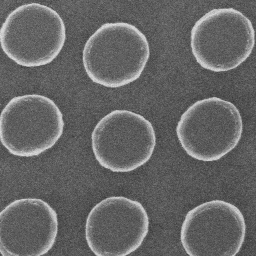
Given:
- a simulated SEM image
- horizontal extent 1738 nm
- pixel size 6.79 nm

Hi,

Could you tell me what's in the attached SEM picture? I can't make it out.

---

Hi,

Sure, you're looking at raised bodies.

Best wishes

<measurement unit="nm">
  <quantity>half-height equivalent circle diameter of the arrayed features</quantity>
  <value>420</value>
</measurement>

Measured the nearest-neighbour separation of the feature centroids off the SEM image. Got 586 nanometres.